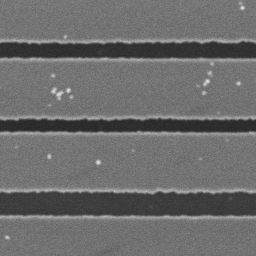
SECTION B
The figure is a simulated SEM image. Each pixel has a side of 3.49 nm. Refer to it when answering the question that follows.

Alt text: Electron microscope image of lines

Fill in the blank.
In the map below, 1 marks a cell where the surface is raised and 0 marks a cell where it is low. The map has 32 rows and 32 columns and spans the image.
11111111111111111111111111111111
11111111111111111111111111111111
11111111111111111111111111111111
11111111111111111111111111111111
11111111111111111111111111111111
00000000000000000000000000000000
00000000000000000000000000000000
11111111111111111111111111111111
11111111111111111111111111111111
11111111111111111111111111111111
11111111111111111111111111111111
11111111111111111111111111111111
11111111111111111111111111111111
11111111111111111111111111111111
11111111111111111111111111111111
00000000000000000000000000000000
00000000000000000000000000000000
11111111111111111111111111111111
11111111111111111111111111111111
11111111111111111111111111111111
11111111111111111111111111111111
11111111111111111111111111111111
11111111111111111111111111111111
11111111111111111111111111111111
00000000000000000000000000000000
00000000000000000000000000000000
00000000000000000000000000000000
11111111111111111111111111111111
11111111111111111111111111111111
11111111111111111111111111111111
11111111111111111111111111111111
11111111111111111111111111111111